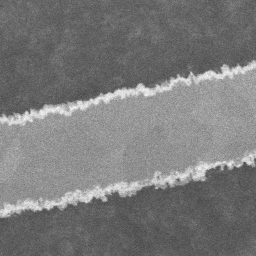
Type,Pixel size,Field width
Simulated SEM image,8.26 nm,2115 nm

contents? one or a few lines or trenches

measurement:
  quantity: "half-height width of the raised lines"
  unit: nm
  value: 758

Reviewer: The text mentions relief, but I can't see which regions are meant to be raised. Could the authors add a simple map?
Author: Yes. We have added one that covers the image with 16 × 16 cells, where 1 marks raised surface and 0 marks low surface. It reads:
0000000000000000
0000000000000000
0000000000000000
0000000000000000
0000000000000011
0000000000111111
0000011111111111
0111111111111111
1111111111111111
1111111111111111
1111111111111000
1111111110000000
1111000000000000
0000000000000000
0000000000000000
0000000000000000